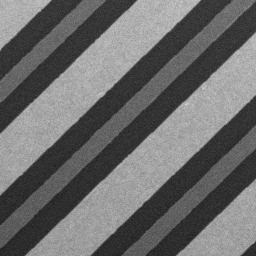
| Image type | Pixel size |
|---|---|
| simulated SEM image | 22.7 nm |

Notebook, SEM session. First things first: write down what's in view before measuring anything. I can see lines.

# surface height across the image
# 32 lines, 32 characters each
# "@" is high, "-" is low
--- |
@@@@@@----@@@----@@@@@@@@----@@@
@@@@@----@@@----@@@@@@@@----@@@-
@@@@----@@@----@@@@@@@@----@@---
@@@----@@@----@@@@@@@@----@@----
@@----@@@----@@@@@@@----@@@-----
@----@@@----@@@@@@@----@@@-----@
----@@@----@@@@@@@----@@@----@@@
---@@@----@@@@@@@----@@@----@@@@
--@@-----@@@@@@@----@@@----@@@@@
-@@----@@@@@@@@----@@@----@@@@@@
@@----@@@@@@@@----@@@----@@@@@@@
@----@@@@@@@@----@@@----@@@@@@@@
----@@@@@@@@----@@@----@@@@@@@@-
---@@@@@@@@----@@@----@@@@@@@@--
--@@@@@@@@----@@@----@@@@@@@@---
-@@@@@@@@----@@@----@@@@@@@@----
@@@@@@@@----@@@----@@@@@@@@----@
@@@@@@@----@@@----@@@@@@@@----@@
@@@@@@----@@@----@@@@@@@@----@@@
@@@@@----@@@----@@@@@@@@----@@@-
@@@@----@@@----@@@@@@@@----@@@--
@@@----@@@----@@@@@@@@----@@@---
@@----@@@----@@@@@@@@----@@@----
@----@@@----@@@@@@@@----@@@----@
----@@@----@@@@@@@@----@@@----@@
---@@@----@@@@@@@@----@@@----@@@
--@@@----@@@@@@@@----@@@----@@@@
-@@@----@@@@@@@@----@@@----@@@@@
@@@----@@@@@@@@----@@@----@@@@@@
@@----@@@@@@@@----@@@----@@@@@@@
@----@@@@@@@@----@@@----@@@@@@@@
----@@@@@@@@----@@@----@@@@@@@--